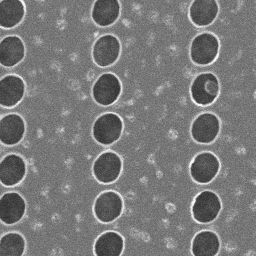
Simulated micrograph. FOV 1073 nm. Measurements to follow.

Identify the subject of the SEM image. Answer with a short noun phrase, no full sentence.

a regular array of holes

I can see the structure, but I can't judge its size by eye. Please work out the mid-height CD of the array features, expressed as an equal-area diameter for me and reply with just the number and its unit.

124 nm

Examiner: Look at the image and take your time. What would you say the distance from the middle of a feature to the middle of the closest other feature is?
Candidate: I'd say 165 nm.